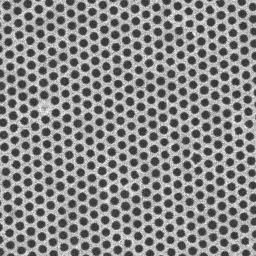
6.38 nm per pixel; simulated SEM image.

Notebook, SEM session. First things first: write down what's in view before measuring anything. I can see a regular array of holes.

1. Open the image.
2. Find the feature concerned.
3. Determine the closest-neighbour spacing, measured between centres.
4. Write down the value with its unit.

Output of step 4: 77.1 nm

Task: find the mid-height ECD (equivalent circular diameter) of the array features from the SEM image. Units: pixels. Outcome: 8.67